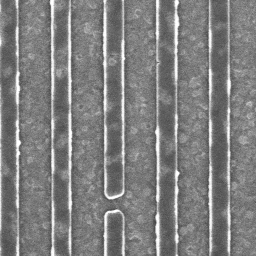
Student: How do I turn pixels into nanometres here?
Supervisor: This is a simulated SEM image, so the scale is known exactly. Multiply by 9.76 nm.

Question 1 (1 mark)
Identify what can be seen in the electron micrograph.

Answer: parallel lines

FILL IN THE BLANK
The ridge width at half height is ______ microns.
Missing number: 0.193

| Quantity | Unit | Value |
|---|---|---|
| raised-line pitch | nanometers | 514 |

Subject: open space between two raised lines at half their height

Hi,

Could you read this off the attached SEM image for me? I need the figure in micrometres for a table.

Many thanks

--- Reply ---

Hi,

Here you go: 0.326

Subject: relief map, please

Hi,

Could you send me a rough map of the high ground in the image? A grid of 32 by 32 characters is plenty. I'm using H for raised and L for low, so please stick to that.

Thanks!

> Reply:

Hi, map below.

HHLLLLHHHLLLLHHLLLLLHHLLLLHHHLLL
HHLLLLHHHLLLLHHLLLLLHHLLLLHHHLLL
HHLLLLHHHLLLLHHLLLLLHHLLLLHHHLLL
HHLLLLHHHLLLLHHLLLLLHHLLLLHHHLLL
HHLLLLHHHLLLLHHLLLLLHHLLLLHHHLLL
HHLLLLHHHLLLLHHLLLLLHHLLLLHHHLLL
HHLLLLHHHLLLLHHLLLLLHHLLLLHHHLLL
HHLLLLLHHLLLLHHHLLLLHHLLLLHHHLLL
HHLLLLLHHLLLLHHLLLLLHHLLLLHHHLLL
HHLLLLLHHLLLLHHLLLLLHHLLLLHHHLLL
HHLLLLLHHLLLLHHLLLLLHHLLLLHHHLLL
HHLLLLLHHLLLLHHLLLLLHHLLLLHHHLLL
HHLLLLLHHLLLLHHLLLLLHHLLLLHHHLLL
HHLLLLLHHLLLLHHLLLLLHHLLLLHHHLLL
HHLLLLLHHLLLLHHLLLLLHHLLLLHHHLLL
HHLLLLHHHLLLLHHLLLLLHHLLLLHHHLLL
HHLLLLLHHLLLLHHLLLLHHHLLLLHHHLLL
HHLLLLLHHLLLLHHLLLLLHHLLLLHHHLLL
HHLLLLHHHLLLLHHLLLLLHHLLLLHHHLLL
HHLLLLHHHLLLLHHLLLLLHHLLLLHHHLLL
HHLLLLHHHLLLLHHLLLLLHHLLLLHHHLLL
HHLLLLLHHLLLLHHLLLLLHHLLLLHHHLLL
HHLLLLLHHLLLLHHLLLLLHHLLLLHHHLLL
HHLLLLLHHLLLLHHLLLLLHHLLLLHHHLLL
HHLLLLLHHLLLLHHLLLLLHHLLLLHHHLLL
HHLLLLLHHLLLLLLLLLLLHHLLLLHHHLLL
HHLLLLLHHLLLLLHLLLLLHHLLLLHHHLLL
HHLLLLLHHLLLLHHLLLLLHHLLLLHHHLLL
HHLLLLLHHLLLLHHLLLLHHHLLLLHHHLLL
HHLLLLLHHLLLLHHLLLLLHHLLLLHHHLLL
HHLLLLLHHLLLLHHLLLLHHHLLLLHHHLLL
HHLLLLHHHLLLLHHLLLLLHHLLLLHHHLLL